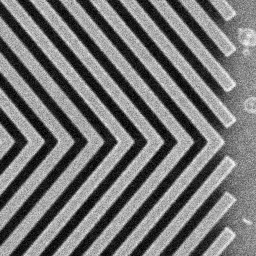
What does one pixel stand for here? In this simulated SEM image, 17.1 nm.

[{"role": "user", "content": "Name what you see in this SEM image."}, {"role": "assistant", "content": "groups of lines, slits or small figures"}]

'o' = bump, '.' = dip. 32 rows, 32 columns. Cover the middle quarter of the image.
oo...oooo....oooo...oooo....oooo
ooo...oooo....oooo...oooo....ooo
ooo....oooo....ooo....oooo....oo
.ooo....oooo...oooo....oooo...oo
.oooo....oooo...oooo....ooo....o
..oooo....ooo....oooo....ooo....
...oooo...oooo....oooo...oooo...
....oooo...oooo....oooo...oooo..
o....ooo....oooo....ooo....oooo.
oo....ooo....oooo...oooo....oooo
ooo...oooo....oooo...oooo....ooo
oooo...oooo....ooo....oooo....oo
.ooo....oooo....ooo....oooo...oo
.oooo....oooo...oooo....oooo...o
..oooo....oooo...oooo....ooo....
...oooo....ooo....oooo...oooo...
....oooo...oooo....oooo...oooo..
o....oooo...oooo....ooo....oooo.
oo....ooo....oooo....ooo....oooo
ooo...oooo....ooo....oooo....ooo
oo....ooo....oooo....ooo....oooo
o....oooo...oooo....ooo....oooo.
....oooo...oooo....oooo...oooo..
...oooo....ooo....oooo...oooo...
..oooo....ooo....oooo....ooo....
.oooo....oooo...oooo....oooo...o
.ooo....oooo...oooo....oooo...oo
ooo....oooo....ooo....oooo....oo
ooo...oooo....oooo...oooo....ooo
oo...oooo....oooo...oooo....oooo
o....ooo....oooo....ooo....oooo.
....oooo...oooo....ooo....oooo..